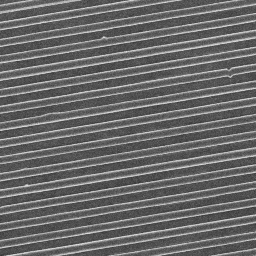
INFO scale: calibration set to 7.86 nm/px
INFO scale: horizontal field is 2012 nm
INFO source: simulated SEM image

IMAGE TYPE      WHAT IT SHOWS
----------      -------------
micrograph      parallel lines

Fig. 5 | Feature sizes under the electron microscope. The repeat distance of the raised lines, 130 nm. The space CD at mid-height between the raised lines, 67.9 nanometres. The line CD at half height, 61.1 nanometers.